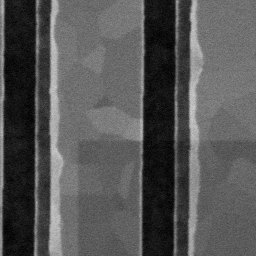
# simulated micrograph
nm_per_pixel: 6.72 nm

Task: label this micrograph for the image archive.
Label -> lines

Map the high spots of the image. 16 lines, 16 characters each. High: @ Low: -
--@@@@@@@--@@@@@
--@@@@@@@--@@@@@
--@@@@@@@--@@@@@
--@@@@@@@--@@@@@
--@@@@@@@--@@@@@
--@@@@@@@--@@@@@
--@@@@@@@--@@@@@
--@@@@@@@--@@@@@
--@@@@@@@--@@@@@
--@@@@@@@--@@@@@
--@@@@@@@--@@@@@
--@@@@@@@--@@@@@
--@@@@@@@--@@@@@
--@@@@@@@--@@@@@
--@@@@@@@--@@@@@
--@@@@@@@--@@@@@